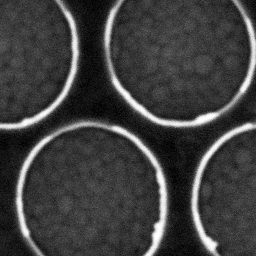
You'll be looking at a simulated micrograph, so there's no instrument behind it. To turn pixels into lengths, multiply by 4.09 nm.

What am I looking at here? holes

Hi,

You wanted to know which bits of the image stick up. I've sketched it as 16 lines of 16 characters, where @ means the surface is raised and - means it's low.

----@@@--------@
----@@@--------@
-----@@---------
-----@@---------
----@@@---------
----@@@@-------@
---@@@@@@-----@@
--@@@@@@@@--@@@@
@@@-----@@@@@@@-
@@-------@@@@---
@@--------@@@---
@---------@@----
@---------@@----
@---------@@----
@@--------@@@---
@@-------@@@@---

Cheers